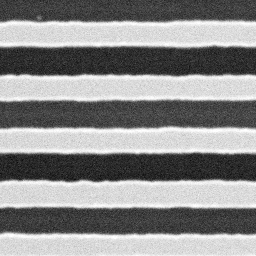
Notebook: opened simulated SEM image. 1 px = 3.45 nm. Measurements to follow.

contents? lines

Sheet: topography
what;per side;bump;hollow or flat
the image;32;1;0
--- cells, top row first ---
00000000000000000000000000000000
00000000000000000000000000000000
00000000000000000000000000000000
11111111111111111111111111111111
11111111111111111111111111111111
11111111111111111111111111111111
00000000000000000000000000000000
00000000000000000000000000000000
00000000000000000000000000000000
11110000001101110010000010001000
11111111111111111111111111111111
11111111111111111111111111111111
11100000011110000000000000000000
00000000000000000000000000000000
00000000000000000000000000000000
00000000000000000000000000000000
11111111111111111111111111111111
11111111111111111111111111111111
11111111111111111111111111111111
00000000000000000000000000000000
00000000000000000000000000000000
00000000000000000000000000000000
00000000000000000000000000000000
11111111111111111111111111111111
11111111111111111111111111111111
11111111111111111111111111111111
00000000000000000000000000000000
00000000000000000000000000000000
00000000000000000000000000000000
11111111111111011111111111111111
11111111111111111111111111111111
11111111111111111111111111111111